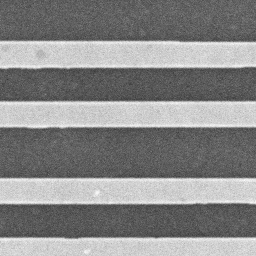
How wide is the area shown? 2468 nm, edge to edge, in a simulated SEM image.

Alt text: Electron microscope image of lines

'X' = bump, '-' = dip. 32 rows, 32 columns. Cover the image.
--------------------------------
--------------------------------
--------------------------------
--------------------------------
--------------------------------
XXXXXXXXXXXXXXXXXXXXXXXXXXXXXXXX
XXXXXXXXXXXXXXXXXXXXXXXXXXXXXXXX
XXXXXXXXXXXXXXXXXXXXXXXXXXXXXXXX
--------------------------------
--------------------------------
--------------------------------
--------------------------------
--------------------------------
XXXXXXXXXXXXXXXXXXXXXXXXXXXXXXXX
XXXXXXXXXXXXXXXXXXXXXXXXXXXXXXXX
XXXXXXXXXXXXXXXXXXXXXXXXXXXXXXXX
--------------------------------
--------------------------------
--------------------------------
--------------------------------
--------------------------------
--------------------------------
XXXXXXXXXXXXXXXXXXXXXXXXXXXXXXXX
XXXXXXXXXXXXXXXXXXXXXXXXXXXXXXXX
XXXXXXXXXXXXXXXXXXXXXXXXXXXXXXXX
--------------------------------
--------------------------------
--------------------------------
--------------------------------
--------------------------------
XXXXXXXXXXXXXXXXXXXXXXXXXXXXXXXX
XXXXXXXXXXXXXXXXXXXXXXXXXXXXXXXX